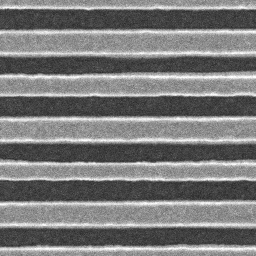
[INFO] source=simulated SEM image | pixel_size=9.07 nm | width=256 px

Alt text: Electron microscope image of lines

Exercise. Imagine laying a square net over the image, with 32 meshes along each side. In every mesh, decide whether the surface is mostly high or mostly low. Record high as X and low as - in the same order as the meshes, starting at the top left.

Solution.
XXXXXXXXXXXXXXXXXXXXXXXXXXXXXXXX
--------------------------------
--------------------------------
--------------------------------
XXXXXXXXXXXXXXXXXXXXXXXXXXXXXXXX
XXXXXXXXXXXXXXXXXXXXXXXXXXXXXXXX
XXXXXXXXXXXXXXXXXXXXXXXXXXXXXXXX
--------------------------------
--------------------------------
XXXXXXXX--XXXXXXXXXXXXXXXXXXXXXX
XXXXXXXXXXXXXXXXXXXXXXXXXXXXXXXX
XXXXXXXXXXXXXXXXXXXXXXXXXXXXXXXX
--------------------------------
--------------------------------
--------------------------------
XXXXXXXXXXXXXXXXXXXXXXXXXXXXXXXX
XXXXXXXXXXXXXXXXXXXXXXXXXXXXXXXX
XXXXXXXXXXXXXXXXXXXXXXXXXXXXXXXX
--------------------------------
--------------------------------
XXXXXXXXXXXXXXXXXXXXXXXXXXXXXXXX
XXXXXXXXXXXXXXXXXXXXXXXXXXXXXXXX
--------------------------------
--------------------------------
--------------------------------
XXXXXXXXXXXXXXXXXXXXXXXXXXXXXXXX
XXXXXXXXXXXXXXXXXXXXXXXXXXXXXXXX
XXXXXXXXXXXXXXXXXXXXXXXXXXXXXXXX
--------------------------------
--------------------------------
--------------------------------
XXXXXXXXXXXXXXXXXXXXXXXXXXXXXXXX